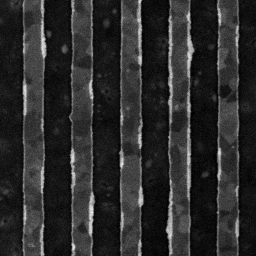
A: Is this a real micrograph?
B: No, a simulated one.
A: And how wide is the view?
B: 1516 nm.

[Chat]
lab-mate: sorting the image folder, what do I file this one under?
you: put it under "parallel lines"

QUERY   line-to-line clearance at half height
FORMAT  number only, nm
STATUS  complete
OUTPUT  167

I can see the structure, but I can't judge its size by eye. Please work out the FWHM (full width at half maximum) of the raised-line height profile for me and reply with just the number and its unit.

123 nanometers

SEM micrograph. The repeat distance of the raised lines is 287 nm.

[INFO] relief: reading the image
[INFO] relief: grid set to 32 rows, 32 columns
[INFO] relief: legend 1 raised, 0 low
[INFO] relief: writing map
00011000011100011100011100011100
00011000011100011100011100011100
00011000011100011100011100011100
00011100011100011100011100011100
00011100011100011100011100011100
00011100011000011100011100011100
00011100011100011100011100011100
00011100011100011100011100011100
00011100011100011100011100011100
00011000011100011100011100011100
00011000011100011100011100011100
00011100011100011100011100011100
00011000011100011100011100011100
00011000011100011100011100011100
00011000011100011100011100011100
00011000011000011100011100011100
00011000011100011100011100011100
00011000011100011100011100011100
00011000011100011100011100011100
00011000011100011100011100011100
00011000011100011100011100011100
00011000011100011100011100011100
00011000011100011100011100011100
00011000011100011100011100011100
00011000011100011100011100011100
00011000011100011100011100011100
00011000011100011100011100011100
00011000011100011100011100011100
00011000011100011100011100011100
00011000011100011100011100011100
00011000011100011100011100011100
00011000011100011100011100011100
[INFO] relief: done